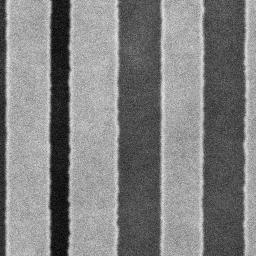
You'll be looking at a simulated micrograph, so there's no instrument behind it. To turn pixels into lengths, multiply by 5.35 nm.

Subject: lines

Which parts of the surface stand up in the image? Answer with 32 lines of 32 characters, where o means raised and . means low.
.ooooo...oooooo.....ooooo......o
.ooooo...oooooo.....ooooo......o
.ooooo...oooooo.....ooooo......o
.ooooo...oooooo.....ooooo......o
.ooooo...oooooo.....ooooo......o
.ooooo...oooooo.....ooooo......o
.ooooo...oooooo.....ooooo......o
.ooooo...oooooo.....ooooo......o
.ooooo...oooooo.....ooooo......o
.ooooo...oooooo.....ooooo......o
.ooooo...oooooo.....ooooo......o
.ooooo...oooooo.....ooooo......o
.ooooo...oooooo.....ooooo......o
.ooooo...oooooo.....ooooo......o
.ooooo...oooooo.....ooooo......o
.ooooo...oooooo.....ooooo......o
.ooooo...oooooo.....ooooo......o
.ooooo...oooooo.....ooooo......o
.ooooo...oooooo.....ooooo......o
.ooooo...oooooo.....ooooo......o
.ooooo...oooooo.....ooooo......o
.ooooo...oooooo.....ooooo......o
.ooooo...oooooo.....ooooo......o
.ooooo...oooooo.....ooooo......o
.ooooo...oooooo.....ooooo......o
.ooooo...oooooo.....ooooo......o
.ooooo...oooooo.....ooooo......o
.ooooo...oooooo.....ooooo......o
.ooooo...oooooo.....ooooo......o
.ooooo...oooooo.....ooooo......o
.ooooo...oooooo.....ooooo......o
.ooooo...oooooo.....ooooo......o